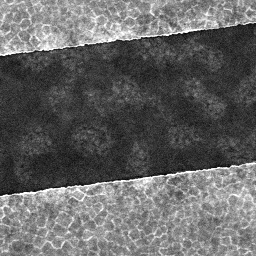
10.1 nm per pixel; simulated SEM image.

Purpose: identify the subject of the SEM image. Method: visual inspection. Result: one or a few lines or trenches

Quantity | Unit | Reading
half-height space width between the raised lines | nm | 1410